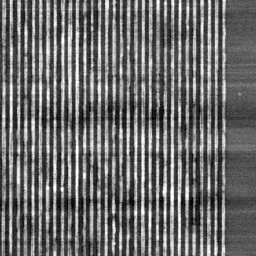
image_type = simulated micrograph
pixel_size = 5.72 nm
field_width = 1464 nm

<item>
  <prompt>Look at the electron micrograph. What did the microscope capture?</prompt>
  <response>parallel lines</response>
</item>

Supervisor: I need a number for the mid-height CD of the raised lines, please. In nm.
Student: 10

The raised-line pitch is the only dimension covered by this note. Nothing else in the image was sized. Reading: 0.0419 µm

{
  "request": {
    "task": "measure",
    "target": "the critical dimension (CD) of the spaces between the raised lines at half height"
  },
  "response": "30.7 nm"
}